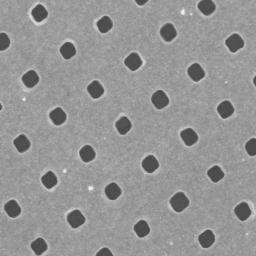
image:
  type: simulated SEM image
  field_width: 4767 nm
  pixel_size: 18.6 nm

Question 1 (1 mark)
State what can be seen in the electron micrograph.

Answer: a regular array of holes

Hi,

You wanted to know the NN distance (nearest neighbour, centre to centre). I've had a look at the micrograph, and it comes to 848 nm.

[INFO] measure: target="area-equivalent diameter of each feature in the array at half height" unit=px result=16.6